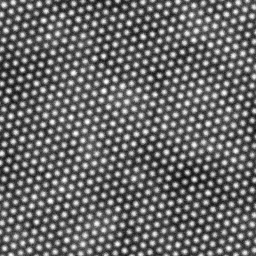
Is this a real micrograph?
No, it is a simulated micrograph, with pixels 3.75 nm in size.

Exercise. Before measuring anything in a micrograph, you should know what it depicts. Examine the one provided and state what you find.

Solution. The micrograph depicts a regular array of raised bodies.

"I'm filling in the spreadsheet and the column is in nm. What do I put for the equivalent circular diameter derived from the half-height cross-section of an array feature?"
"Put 16.9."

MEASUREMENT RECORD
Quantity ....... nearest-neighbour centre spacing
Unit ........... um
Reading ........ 0.0349